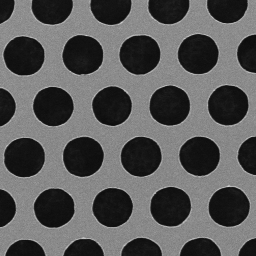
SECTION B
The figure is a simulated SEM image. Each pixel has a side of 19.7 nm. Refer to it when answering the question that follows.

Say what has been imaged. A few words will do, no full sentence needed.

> a regular array of holes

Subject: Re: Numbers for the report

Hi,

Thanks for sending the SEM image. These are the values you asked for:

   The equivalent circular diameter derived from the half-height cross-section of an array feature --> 794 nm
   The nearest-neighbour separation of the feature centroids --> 1140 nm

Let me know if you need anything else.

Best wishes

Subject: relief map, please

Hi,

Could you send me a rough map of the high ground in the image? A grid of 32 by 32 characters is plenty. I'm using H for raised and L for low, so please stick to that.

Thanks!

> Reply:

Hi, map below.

LLHHLLLLLHHLLLLLHHLLLLLLHHLLLLLH
LLHHLLLLLHHHLLLLHHHLLLLHHHLLLLLH
LHHHHLLLHHHHLLLHHHHHLLLHHHHLLLHH
HHHHHHHHHHHHHHHHHHHHHHHHHHHHHHHH
HHHHHHHHHLLHHHHHHLLHHHHHLLHHHHHL
HLLLLHHHLLLLHHHLLLLLHHHLLLLHHHLL
LLLLLHHHLLLLLHHLLLLLHHLLLLLHHHLL
LLLLLHHHLLLLLHHLLLLLHHLLLLLHHHLL
HLLLLHHHLLLLHHHHLLLHHHHLLLLHHHLL
HHHHHHHHHHHHHHHHHHHHHHHHHHHHHHHH
HHHHHHHHHHHHHHHHHHHHHHHHHHHHHHHH
LHHHHLLLHHHHLLLLHHHLLLLHHHHLLLHH
LLHHLLLLLHHHLLLLHHHLLLLLHHLLLLLH
LLHHLLLLLHHHLLLLHHHLLLLLHHLLLLLH
LLHHHLLLLHHHLLLLHHHLLLLHHHLLLLLH
LHHHHHLLHHHHHLLHHHHHLLHHHHHLLHHH
HHHHHHHHHHHHHHHHHHHHHHHHHHHHHHHH
HHLLHHHHHLLLHHHHLLLHHHHHLLHHHHHL
HLLLLHHHLLLLLHHLLLLLHHHLLLLHHHLL
LLLLLLHHLLLLLHHLLLLLHHLLLLLHHHLL
HLLLLHHHLLLLLHHLLLLLHHHLLLLHHHLL
HLLLLHHHHLLLHHHHLLLHHHHLLLHHHHHL
HHHHHHHHHHHHHHHHHHHHHHHHHHHHHHHH
HHHHHHHHHHHHHHHHHHHHHLHHHHHHLLHH
LHHHHLLLLHHHLLLLHHHLLLLLHHHLLLLH
LLHHLLLLLHHHLLLLLHHLLLLLHHLLLLLH
LLHHLLLLLHHHLLLLHHHLLLLLHHLLLLLH
LHHHHLLLLHHHLLLLHHHLLLLHHHHLLLLH
HHHHHHHHHHHHHHHHHHHHHHHHHHHHHHHH
HHHHHHHHHHHHHHHHHHHHHHHHHHHHHHHH
HHLLLHHHHLLLHHHHLLLHHHHLLLLHHHHL
HLLLLLHHLLLLLHHLLLLLHHHLLLLLHHLL